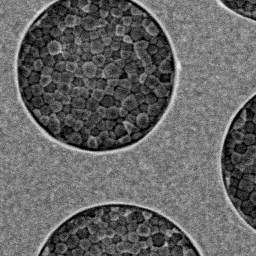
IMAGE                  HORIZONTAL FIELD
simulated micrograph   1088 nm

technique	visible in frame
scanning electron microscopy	holes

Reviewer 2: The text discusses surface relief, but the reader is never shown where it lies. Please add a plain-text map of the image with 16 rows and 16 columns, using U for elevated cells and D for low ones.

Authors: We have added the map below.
UUUDDDDDDUUUUUDD
UUDDDDDDDDUUUUUU
UDDDDDDDDDDUUUUU
UDDDDDDDDDDUUUUU
UDDDDDDDDDDUUUUU
UDDDDDDDDDDUUUUU
UUDDDDDDDDDUUUUD
UUDDDDDDDDUUUUUD
UUUDDDDDDUUUUUDD
UUUUUUUUUUUUUUDD
UUUUUUUUUUUUUUDD
UUUUUUUUUUUUUUDD
UUUUUUUUUUUUUUDD
UUUUUDDDDDUUUUUD
UUUDDDDDDDDUUUUU
UUUDDDDDDDDDUUUU